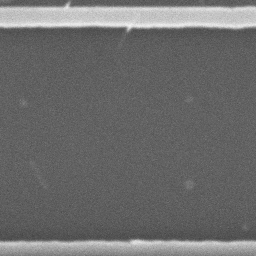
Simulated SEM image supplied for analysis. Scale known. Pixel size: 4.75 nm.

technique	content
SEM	lines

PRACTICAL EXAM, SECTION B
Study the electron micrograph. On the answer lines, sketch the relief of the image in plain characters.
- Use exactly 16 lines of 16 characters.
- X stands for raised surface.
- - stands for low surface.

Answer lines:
XXXXXXXXXXXXXXXX
XXXXXXXXXXXXXXXX
----------------
----------------
----------------
----------------
----------------
----------------
----------------
----------------
----------------
----------------
----------------
----------------
----------------
XXXXXXXXXXXXXXXX